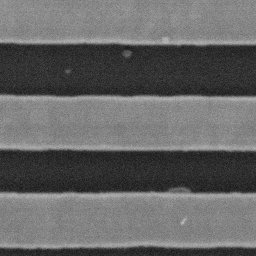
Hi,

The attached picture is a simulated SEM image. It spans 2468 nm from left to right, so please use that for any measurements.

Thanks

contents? lines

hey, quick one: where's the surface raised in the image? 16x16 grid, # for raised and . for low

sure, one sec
################
################
################
................
................
................
################
################
################
................
................
................
################
################
################
...#............